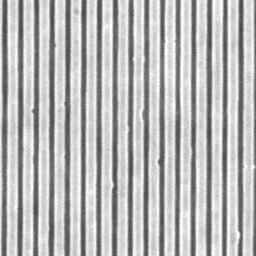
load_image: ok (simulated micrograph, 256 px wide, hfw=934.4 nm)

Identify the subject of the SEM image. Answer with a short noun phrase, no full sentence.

parallel lines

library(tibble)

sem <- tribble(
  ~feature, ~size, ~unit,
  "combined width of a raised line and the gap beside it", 0.0574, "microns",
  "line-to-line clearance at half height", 24.2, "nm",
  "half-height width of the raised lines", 31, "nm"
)